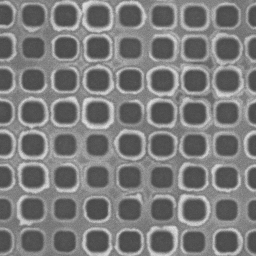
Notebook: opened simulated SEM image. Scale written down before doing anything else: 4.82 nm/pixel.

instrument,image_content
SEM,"a regular array of holes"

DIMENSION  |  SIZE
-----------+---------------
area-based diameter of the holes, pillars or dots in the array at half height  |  111 nanometers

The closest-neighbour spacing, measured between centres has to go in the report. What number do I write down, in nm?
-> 154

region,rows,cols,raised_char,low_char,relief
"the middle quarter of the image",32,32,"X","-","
XXXXXXXXXXXXXXXXXXXXXXXXXXXXXXXX
--XXXXX---XXXXX---XXXXXX--XXXXX-
---XXX-----XXX-----XXX-----XXX--
---XX------XXX------XX-----XXX--
---XX------XXX------XX-----XXX--
---XXX-----XXX-----XXX-----XXX--
--XXXXX---XXXXX----XXXX----XXXX-
XXXXXXXXXXXXXXXXXXXXXXXXXXXXXXXX
XXXXXXXXXXXXXXXXXXXXXXXXXXXXXXXX
-XXXXXX---XXXXXX-XXXXXX---XXXXXX
---XXX-----XXX-----XXX-----XXX--
---XX------XXX-----XXX-----XXX--
---XX------XXX------XX-----XXX--
---XXX-----XXX-----XXX-----XXX--
---XXX-----XXX-----XXX-----XXXX-
XXXXXXXXXXXXXXXXXXXXXXXXXXXXXXXX
XXXXXXXXXXXXXXXXXXXXXXXXXXXXXXXX
--XXXXX--XXXXXX---XXXXXXXXXXXXXX
---XXX-----XXX-----XXX-----XXX--
---XX------XXX-----XXX------XX--
---XX------XXX------XX------XX--
---XXX-----XXX-----XXX-----XXX--
--XXXX-----XXXX----XXX----XXXXX-
XXXXXXXXXXXXXXXXXXXXXXXXXXXXXXXX
XXXXXXXXXXXXXXXXXXXXXXXXXXXXXXXX
-XXXXXXXXXXXXXXXXXXXXXXXXXXXXXXX
---XXX-----XXX-----XXX-----XXX--
---XXX-----XXX-----XXX-----XXX--
---XXX-----XXX-----XXX-----XXX--
---XXX-----XXX-----XXX-----XXX--
--XXXX-----XXX-----XXX-----XXX--
XXXXXXXXXXXXXXXXXXXXXXXXXXXXXXXX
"